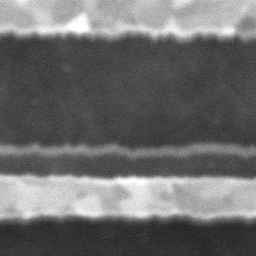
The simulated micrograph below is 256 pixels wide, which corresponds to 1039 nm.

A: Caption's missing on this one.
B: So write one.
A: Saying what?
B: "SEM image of lines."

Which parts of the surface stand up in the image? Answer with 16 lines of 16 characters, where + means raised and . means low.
++++++++++++++++
++++++++++++++++
................
................
................
................
................
................
................
+.+.+.++....+++.
++++++++++++++++
++++++++++++++++
++++++++++++++++
++......+...++.+
................
................